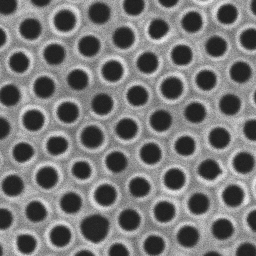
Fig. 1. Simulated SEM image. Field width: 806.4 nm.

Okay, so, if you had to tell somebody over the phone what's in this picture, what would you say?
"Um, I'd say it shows a regular array of holes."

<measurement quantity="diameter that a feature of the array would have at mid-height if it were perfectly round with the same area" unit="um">0.0641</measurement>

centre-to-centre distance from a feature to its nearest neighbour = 108 nanometers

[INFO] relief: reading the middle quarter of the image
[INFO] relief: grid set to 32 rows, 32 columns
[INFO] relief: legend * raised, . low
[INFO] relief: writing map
**********....****.....*********
**..******.....****....*********
*.....****.....*****************
*.....****....*************.****
*.....*******************....***
**....************.*****......**
****************....****......**
****************.....****....***
********....****.....*****.*****
*******.....****.....***********
...****.....*****..************.
....***.....******************..
....*****.************....****..
...*******************.....****.
..************....****.....*****
*************.....****....******
*****....****.....*****..*******
*****.....***.....**************
****......****...************...
.****....*******************....
.****...************...*****....
.******************.....****....
***********....****.....*****...
***********.....***.....********
****.*****......****...*********
**....*****....*****************
**.....****....***********...***
**.....******************.....**
***...************..*****.....**
*****************....****.....**
*********...****......****...***
********.....***.....***********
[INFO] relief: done